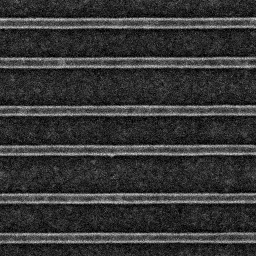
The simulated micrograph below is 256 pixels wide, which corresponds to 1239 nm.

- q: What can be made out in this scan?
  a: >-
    parallel lines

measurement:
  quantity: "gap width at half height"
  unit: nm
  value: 151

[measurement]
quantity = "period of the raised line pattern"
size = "208 nm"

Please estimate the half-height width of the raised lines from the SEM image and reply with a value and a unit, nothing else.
41.7 nm